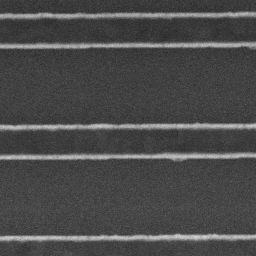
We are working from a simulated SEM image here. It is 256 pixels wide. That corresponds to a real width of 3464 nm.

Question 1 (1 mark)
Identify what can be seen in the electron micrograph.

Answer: lines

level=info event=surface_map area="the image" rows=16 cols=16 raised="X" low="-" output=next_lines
----------------
XXXXXXXXXXXXXXXX
XXXXXXXXXXXXXXXX
----------------
----------------
----------------
----------------
----------------
XXXXXXXXXXXXXXXX
XXXXXXXXXXXXXXXX
----------------
----------------
----------------
----------------
----------------
XXXXXXXXXXXXXXXX